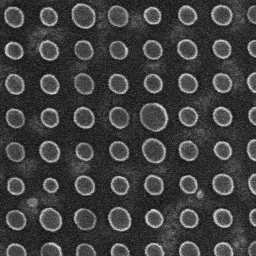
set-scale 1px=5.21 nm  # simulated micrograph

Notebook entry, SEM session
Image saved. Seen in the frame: a regular array of raised bodies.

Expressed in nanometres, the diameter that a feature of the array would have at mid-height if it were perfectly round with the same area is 98.5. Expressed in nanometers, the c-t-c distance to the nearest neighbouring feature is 175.